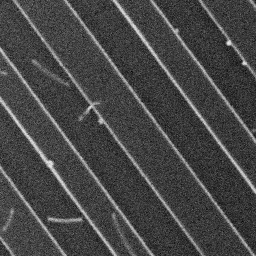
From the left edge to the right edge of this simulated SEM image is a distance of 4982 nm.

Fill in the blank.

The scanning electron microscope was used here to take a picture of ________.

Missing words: lines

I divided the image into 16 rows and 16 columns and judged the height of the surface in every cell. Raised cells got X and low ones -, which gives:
-XXXX--XXX---XXX
--XXX---XXX---XX
---XXX---XX---XX
---XXXX---XX---X
X---XXX---XXX---
XX---XXX---XXX--
XXX---XXX---XX--
-XX---XXXX---XX-
--XX---XXX---XXX
--XXX---XXX---XX
---XXX---XXX---X
X---XX---XXXX---
XX---XX---XXX---
XX---XXX---XXX--
XXX---XX----XXX-
XXXX---XX---XXXX